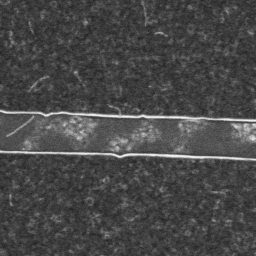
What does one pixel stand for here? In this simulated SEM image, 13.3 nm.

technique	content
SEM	one or a few lines or trenches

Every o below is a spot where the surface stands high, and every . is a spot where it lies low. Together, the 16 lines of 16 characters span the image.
oooooooooooooooo
oooooooooooooooo
oooooooooooooooo
oooooooooooooooo
oooooooooooooooo
oooooooooooooooo
oooooooooooooooo
...............o
................
o...............
oooooooooooooooo
oooooooooooooooo
oooooooooooooooo
oooooooooooooooo
oooooooooooooooo
oooooooooooooooo